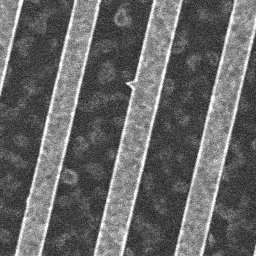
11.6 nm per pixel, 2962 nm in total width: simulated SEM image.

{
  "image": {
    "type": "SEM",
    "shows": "one or a few lines or trenches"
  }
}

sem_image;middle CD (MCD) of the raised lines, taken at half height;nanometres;306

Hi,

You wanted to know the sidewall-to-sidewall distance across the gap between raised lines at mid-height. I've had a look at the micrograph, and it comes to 604 nm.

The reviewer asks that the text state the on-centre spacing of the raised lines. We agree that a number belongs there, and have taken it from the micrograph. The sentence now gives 0.904 microns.